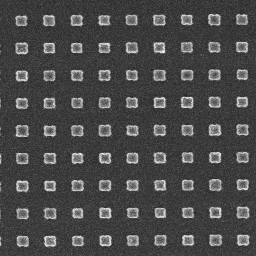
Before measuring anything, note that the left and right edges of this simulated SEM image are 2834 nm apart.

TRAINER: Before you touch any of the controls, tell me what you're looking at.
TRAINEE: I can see a regular array of raised bodies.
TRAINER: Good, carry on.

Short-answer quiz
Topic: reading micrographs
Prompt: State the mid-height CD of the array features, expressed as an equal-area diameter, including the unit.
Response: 11.7 pixels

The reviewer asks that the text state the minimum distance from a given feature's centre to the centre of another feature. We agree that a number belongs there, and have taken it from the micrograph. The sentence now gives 302 nm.